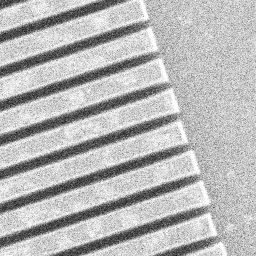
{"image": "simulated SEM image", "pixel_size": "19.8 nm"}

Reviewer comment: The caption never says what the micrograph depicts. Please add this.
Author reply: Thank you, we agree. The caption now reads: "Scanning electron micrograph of parallel lines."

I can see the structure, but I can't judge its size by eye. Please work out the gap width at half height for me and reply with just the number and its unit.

0.214 micrometres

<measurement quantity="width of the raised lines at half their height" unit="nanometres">427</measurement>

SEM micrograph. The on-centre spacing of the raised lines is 630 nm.